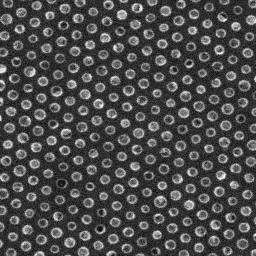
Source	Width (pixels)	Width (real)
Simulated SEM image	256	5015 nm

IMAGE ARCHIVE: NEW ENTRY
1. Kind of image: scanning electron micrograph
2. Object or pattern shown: a regular array of raised bodies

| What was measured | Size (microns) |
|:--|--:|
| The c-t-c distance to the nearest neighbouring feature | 0.32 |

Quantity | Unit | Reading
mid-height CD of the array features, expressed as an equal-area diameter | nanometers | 167